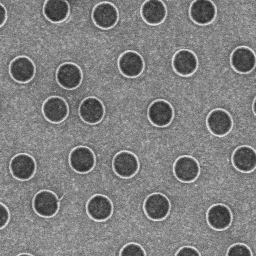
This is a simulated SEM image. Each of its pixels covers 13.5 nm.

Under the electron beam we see a regular array of raised bodies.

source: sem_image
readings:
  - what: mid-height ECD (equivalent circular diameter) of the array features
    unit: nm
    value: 356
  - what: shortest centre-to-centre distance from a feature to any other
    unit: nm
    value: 643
